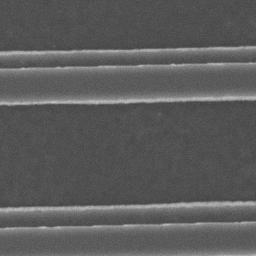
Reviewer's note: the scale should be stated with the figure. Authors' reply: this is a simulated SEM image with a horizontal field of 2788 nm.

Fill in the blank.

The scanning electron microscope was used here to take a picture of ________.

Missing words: lines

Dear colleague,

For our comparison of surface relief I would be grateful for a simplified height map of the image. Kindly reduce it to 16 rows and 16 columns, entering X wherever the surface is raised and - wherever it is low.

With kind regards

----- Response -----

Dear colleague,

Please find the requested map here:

----------------
----------------
----------------
XXXXXXXXXXXXXXXX
XXXXXXXXXXXXXXXX
XXXXXXXXXXXXXXXX
----------------
----------------
----------------
----------------
----------------
----------------
----------------
XXXXXXXXXXXXXXXX
XXXXXXXXXXXXXXXX
XXXXXXXXXXXXXXXX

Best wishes